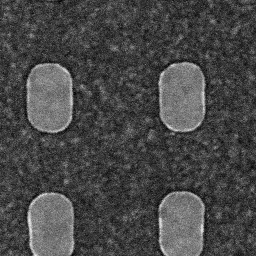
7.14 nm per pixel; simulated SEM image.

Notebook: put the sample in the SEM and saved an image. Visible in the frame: raised bodies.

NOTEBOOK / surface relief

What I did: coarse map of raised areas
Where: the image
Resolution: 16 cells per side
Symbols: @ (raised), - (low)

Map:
----------------
----------------
----------------
----------------
--@@------@@@---
--@@@-----@@@---
--@@@-----@@@---
--@@------@@@---
----------------
----------------
----------------
----------------
--@@------@@----
--@@@-----@@@---
--@@@-----@@@---
--@@@-----@@@---